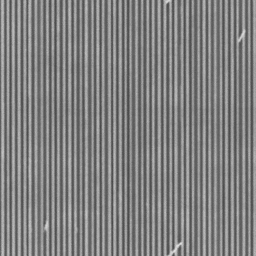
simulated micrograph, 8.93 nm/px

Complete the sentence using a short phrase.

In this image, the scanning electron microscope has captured parallel lines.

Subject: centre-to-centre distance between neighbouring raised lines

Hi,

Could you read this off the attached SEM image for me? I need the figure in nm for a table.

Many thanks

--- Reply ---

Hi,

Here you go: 50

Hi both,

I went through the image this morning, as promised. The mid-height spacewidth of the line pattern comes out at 2.88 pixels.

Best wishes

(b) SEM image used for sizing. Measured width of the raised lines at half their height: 25.7 nanometres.